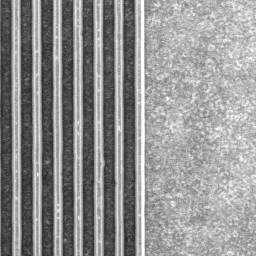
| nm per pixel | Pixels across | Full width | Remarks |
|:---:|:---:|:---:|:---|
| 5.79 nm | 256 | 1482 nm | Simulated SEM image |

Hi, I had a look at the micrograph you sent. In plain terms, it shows parallel lines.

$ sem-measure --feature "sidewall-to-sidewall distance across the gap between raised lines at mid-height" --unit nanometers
81.7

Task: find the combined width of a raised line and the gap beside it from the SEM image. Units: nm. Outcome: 119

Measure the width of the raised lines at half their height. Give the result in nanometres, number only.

36.2